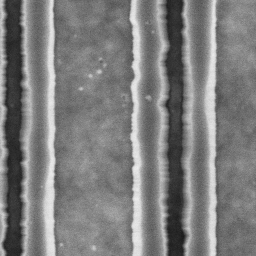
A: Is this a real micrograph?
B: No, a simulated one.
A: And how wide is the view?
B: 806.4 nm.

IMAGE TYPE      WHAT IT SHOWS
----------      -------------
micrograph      lines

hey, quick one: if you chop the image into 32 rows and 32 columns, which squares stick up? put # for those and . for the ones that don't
...####..........###...####.....
#..####.........#####..####.....
#..####.........#####..####.....
#..####..........####..####.....
#..####..........####..####.....
#..####..........####..####.....
#..####..........####..####.....
#..####..........####..####.....
#..####..........####..####.....
#..####..........####..####.....
#..####..........####..####.....
#..####..........####..####.....
...####..........####..####.....
#..####..........####..####.....
#..####..........####..####.....
...####..........####..####.....
#..####..........####..####.....
#..####..........####..####.....
#..####..........####..####.....
#..####..........####..####.....
#..####..........####..####.....
#..####..........####..####.....
#..####..........####..####.....
#..###...........####..####.....
#..####..........####..####.....
#..###...........####..####.....
#..###...........####..####.....
#..###...........####..####.....
#..###...........####..####.....
#..###...........####..####.....
...####..........####..####.....
#..####..........####..####.....